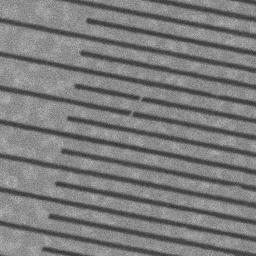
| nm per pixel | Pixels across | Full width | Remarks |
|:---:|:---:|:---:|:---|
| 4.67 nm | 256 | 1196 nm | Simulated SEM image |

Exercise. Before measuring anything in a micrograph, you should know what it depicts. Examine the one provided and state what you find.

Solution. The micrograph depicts parallel lines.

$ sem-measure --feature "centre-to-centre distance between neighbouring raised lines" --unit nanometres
77.5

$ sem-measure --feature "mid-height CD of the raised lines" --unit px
11.8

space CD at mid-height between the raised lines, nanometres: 25.3